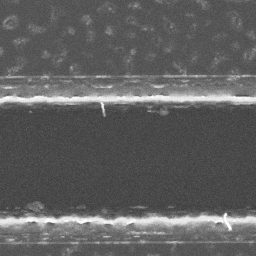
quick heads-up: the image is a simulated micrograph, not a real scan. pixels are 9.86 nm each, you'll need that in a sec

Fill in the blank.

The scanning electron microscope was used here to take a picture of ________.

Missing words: one or a few lines or trenches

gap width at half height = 1190 nanometres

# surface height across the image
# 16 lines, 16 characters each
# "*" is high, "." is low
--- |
****************
****************
****************
****************
****************
****************
................
................
................
................
................
................
................
................
****************
****************